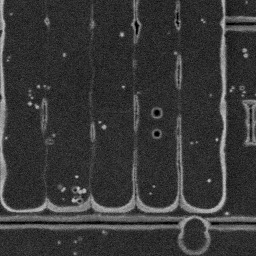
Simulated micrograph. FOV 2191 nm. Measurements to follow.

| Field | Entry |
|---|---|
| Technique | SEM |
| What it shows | wiring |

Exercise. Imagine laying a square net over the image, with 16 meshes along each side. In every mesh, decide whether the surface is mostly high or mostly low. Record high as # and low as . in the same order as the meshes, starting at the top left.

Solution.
##############..
##############..
##############..
##############..
##############..
##############..
##############..
##############..
##############..
##############..
##############..
##############..
##############..
................
................
................